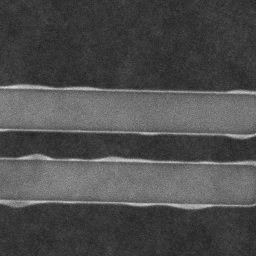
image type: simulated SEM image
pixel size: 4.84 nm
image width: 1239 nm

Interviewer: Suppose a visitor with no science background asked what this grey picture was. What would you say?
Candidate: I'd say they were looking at groups of lines, slits or small figures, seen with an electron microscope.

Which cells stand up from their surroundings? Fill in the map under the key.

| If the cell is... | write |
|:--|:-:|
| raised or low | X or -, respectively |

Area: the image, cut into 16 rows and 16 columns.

XXXXXXXXXXXXXXXX
XXXXXXXXXXXXXXXX
XXXXXXXXXXXXXXXX
XXXXXXXXXXXXXXXX
XXXXXXXXXXXXXXXX
---XXXXXXXXXXXXX
----------------
----------------
XXXXXXXXXXXXXXX-
XXXXXXXXXXXXXXXX
----------------
----------------
----------------
XXXXXXXXXXXXXXXX
XXXXXXXXXXXXXXXX
XXXXXXXXXXXXXXXX